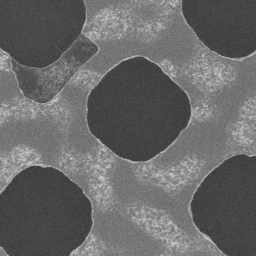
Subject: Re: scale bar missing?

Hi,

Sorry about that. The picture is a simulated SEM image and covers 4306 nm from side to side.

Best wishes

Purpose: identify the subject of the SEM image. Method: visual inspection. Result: holes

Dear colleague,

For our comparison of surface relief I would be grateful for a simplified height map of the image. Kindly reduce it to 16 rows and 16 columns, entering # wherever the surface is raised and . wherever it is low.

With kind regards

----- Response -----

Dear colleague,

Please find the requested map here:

.....######.....
.....#######....
......#######...
#.....########.#
#....##...######
#...##.....#####
#####.......####
#####.......####
######.....#####
#######...######
##.###########..
#....########...
......######....
......######....
......#######...
.....#########..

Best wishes